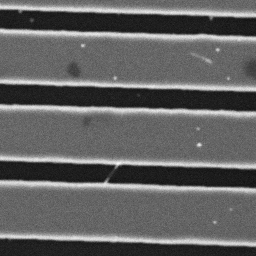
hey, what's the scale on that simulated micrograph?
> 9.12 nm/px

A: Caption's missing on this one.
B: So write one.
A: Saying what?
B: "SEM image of lines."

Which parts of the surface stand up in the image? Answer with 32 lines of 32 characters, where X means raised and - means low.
XXXXXXXXXXXXXXXXXXXXXXXXXXXXXXXX
------------XXXXXXXXXXXXXXXXXXXX
--------------------------------
--------------------------------
XXXXXXXXXXXXXXXXXXXXXXXXXXXXXX--
XXXXXXXXXXXXXXXXXXXXXXXXXXXXXXXX
XXXXXXXXXXXXXXXXXXXXXXXXXXXXXXXX
XXXXXXXXXXXXXXXXXXXXXXXXXXXXXXXX
XXXXXXXXXXXXXXXXXXXXXXXXXXXXXXXX
XXXXXXXXXXXXXXXXXXXXXXXXXXXXXXXX
-XXXXXXXXXXXXXXXXXXXXXXXXXXXXXXX
--------------------------------
--------------------------------
XXXXXXXXXXXXXX------------------
XXXXXXXXXXXXXXXXXXXXXXXXXXXXXXXX
XXXXXXXXXXXXXXXXXXXXXXXXXXXXXXXX
XXXXXXXXXXXXXXXXXXXXXXXXXXXXXXXX
XXXXXXXXXXXXXXXXXXXXXXXXXXXXXXXX
XXXXXXXXXXXXXXXXXXXXXXXXXXXXXXXX
XXXXXXXXXXXXXXXXXXXXXXXXXXXXXXXX
-------------XXXXXXXXXXXXXXXXXXX
--------------------------------
--------------------------------
XXXXXXXXXXXXXXXXXXXXXXXXXXXXXXX-
XXXXXXXXXXXXXXXXXXXXXXXXXXXXXXXX
XXXXXXXXXXXXXXXXXXXXXXXXXXXXXXXX
XXXXXXXXXXXXXXXXXXXXXXXXXXXXXXXX
XXXXXXXXXXXXXXXXXXXXXXXXXXXXXXXX
XXXXXXXXXXXXXXXXXXXXXXXXXXXXXXXX
XXXXXXXXXXXXXXXXXXXXXXXXXXXXXXXX
-------------------------XXXXXXX
--------------------------------